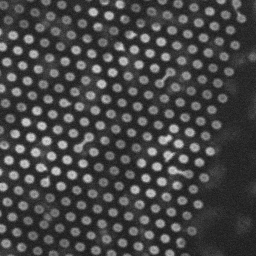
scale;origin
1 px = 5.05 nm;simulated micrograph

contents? a regular array of raised bodies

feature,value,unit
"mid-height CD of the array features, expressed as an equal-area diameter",40.3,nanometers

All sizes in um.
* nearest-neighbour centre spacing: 0.0792